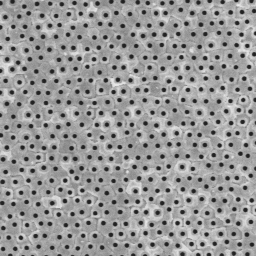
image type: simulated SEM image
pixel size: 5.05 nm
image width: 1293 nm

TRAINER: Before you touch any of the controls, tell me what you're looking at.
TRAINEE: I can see a regular array of holes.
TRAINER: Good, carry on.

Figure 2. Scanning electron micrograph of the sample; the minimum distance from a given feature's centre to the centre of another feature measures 54.5 nm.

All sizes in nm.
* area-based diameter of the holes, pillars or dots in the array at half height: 22.1